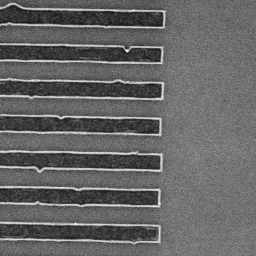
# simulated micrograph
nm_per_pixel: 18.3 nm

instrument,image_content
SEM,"parallel lines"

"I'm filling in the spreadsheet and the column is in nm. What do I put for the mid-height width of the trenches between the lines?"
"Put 364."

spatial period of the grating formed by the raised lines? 656 nanometres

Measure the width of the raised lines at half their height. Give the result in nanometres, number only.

286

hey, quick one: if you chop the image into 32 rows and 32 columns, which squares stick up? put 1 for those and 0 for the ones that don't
00000000000000000000000000000000
11111111111111111111000000000000
11111111111111111111100000000000
00000000000000000000000000000000
00000000000000000000000000000000
00000000000000000000000000000000
11111111111111111111000000000000
10111111111111111111000000000000
00000000000000000000000000000000
00000000000000000000000000000000
11111111111111111111000000000000
11111111111111111111000000000000
00000000000000000000000000000000
00000000000000000000000000000000
11000110000000000000000000000000
11111111111111111111000000000000
00000111001111111111000000000000
00000000000000000000000000000000
00000000000000000000000000000000
11111111111111111111000000000000
11111111111111111111000000000000
00000000000000000000000000000000
00000000000000000000000000000000
11111111100000000000000000000000
11111111111111111111000000000000
00000011111111111111000000000000
00000000000000000000000000000000
00000000000000000000000000000000
11111111111111111111000000000000
11111111111111111111000000000000
00000000000000000000000000000000
00000000000000000000000000000000